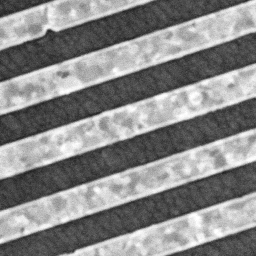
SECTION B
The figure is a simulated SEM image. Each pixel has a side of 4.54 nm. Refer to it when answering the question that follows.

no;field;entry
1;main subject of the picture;one or a few lines or trenches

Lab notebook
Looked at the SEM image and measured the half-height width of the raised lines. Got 128 nanometres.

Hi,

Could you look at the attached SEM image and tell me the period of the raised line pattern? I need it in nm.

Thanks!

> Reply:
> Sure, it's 279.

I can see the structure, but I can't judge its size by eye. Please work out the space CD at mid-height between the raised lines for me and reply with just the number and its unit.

0.151 µm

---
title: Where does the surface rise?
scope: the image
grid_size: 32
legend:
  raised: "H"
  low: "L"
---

LLLLLLHHHHHHHHHHHLLLLLLLLLLLLLLH
LLLHHHHHHHHHHHLLLLLLLLLLLLLLHHHH
HHHHHHHHHHHLLLLLLLLLLLLLHHHHHHHH
HHHHHHHHLLLLLLLLLLLLLHHHHHHHHHHH
HHHHHLLLLLLLLLLLLLHHHHHHHHHHHHLL
HHLLLLLLLLLLLLLHHHHHHHHHHHHLLLLL
LLLLLLLLLLLLHHHHHHHHHHHHLLLLLLLL
LLLLLLLLLHHHHHHHHHHHHLLLLLLLLLLL
LLLLLLHHHHHHHHHHHLLLLLLLLLLLLLLH
LLLHHHHHHHHHHHLLLLLLLLLLLLLLHHHH
HHHHHHHHHHHLLLLLLLLLLLLLLHHHHHHH
HHHHHHHHLLLLLLLLLLLLLLHHHHHHHHHH
HHHHHLLLLLLLLLLLLLLHHHHHHHHHHHLL
HHLLLLLLLLLLLLLHHHHHHHHHHHHLLLLL
LLLLLLLLLLLLHHHHHHHHHHHHLLLLLLLL
LLLLLLLLLHHHHHHHHHHHHLLLLLLLLLLL
LLLLLLHHHHHHHHHHHHLLLLLLLLLLLLLH
LLLHHHHHHHHHHHHLLLLLLLLLLLLLHHHH
HHHHHHHHHHHHLLLLLLLLLLLLLHHHHHHH
HHHHHHHHHLLLLLLLLLLLLLHHHHHHHHHH
HHHHHLLLLLLLLLLLLLLHHHHHHHHHHHLL
HHLLLLLLLLLLLLLLHHHHHHHHHHHLLLLL
LLLLLLLLLLLLLHHHHHHHHHHHLLLLLLLL
LLLLLLLLLLHHHHHHHHHHHLLLLLLLLLLL
LLLLLLLHHHHHHHHHHHLLLLLLLLLLLLLH
LLLLHHHHHHHHHHHLLLLLLLLLLLLLHHHH
HHHHHHHHHHHLLLLLLLLLLLLLLHHHHHHH
HHHHHHHHLLLLLLLLLLLLLLHHHHHHHHHH
HHHHHLLLLLLLLLLLLLLHHHHHHHHHHHHL
HHLLLLLLLLLLLLLLHHHHHHHHHHHHLLLL
LLLLLLLLLLLLLHHHHHHHHHHHLLLLLLLL
LLLLLLLLLLHHHHHHHHHHHLLLLLLLLLLL